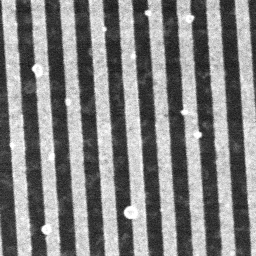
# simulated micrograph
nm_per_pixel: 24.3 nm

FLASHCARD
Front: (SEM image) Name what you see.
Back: parallel lines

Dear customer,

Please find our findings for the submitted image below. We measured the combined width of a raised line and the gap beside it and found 0.708 microns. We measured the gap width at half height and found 406 nm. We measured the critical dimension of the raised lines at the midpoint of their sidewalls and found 309 nanometers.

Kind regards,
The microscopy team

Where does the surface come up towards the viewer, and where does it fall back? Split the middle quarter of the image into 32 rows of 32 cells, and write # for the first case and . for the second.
###.....###....###....###....###
###.....###....###....###....###
###.....###....###....###....###
###.....###....###....###.....##
###.....###....###....###.....##
.##.....###....###....###.....##
.###....###....###.....###....##
.###....###....###.....###....##
.###....###....###.....###....##
####....###....###.....###....##
.###....###....###.....###....##
.###....###....###.....###....##
.###....###.....###....###....##
.###....###.....###....###....##
.###....###.....###....###....##
.###.....##.....###....###....##
.###.....###....###....###....##
.###.....###....###....###....##
.###.....###....###....###.....#
.###.....###....###....###.....#
.###.....###....###....###.....#
..###....###....###....###.....#
..###....###....###.....###....#
.####....###....###.....###....#
..###....###....###.....###....#
..###....###....###.....###....#
..###....###....###.....###....#
..###....###.....##.....###....#
..###....###.....###....###....#
..###....###.....###....###....#
..###....###.....###....###....#
..###.....###....###....###....#